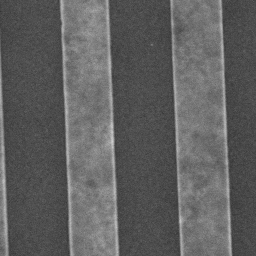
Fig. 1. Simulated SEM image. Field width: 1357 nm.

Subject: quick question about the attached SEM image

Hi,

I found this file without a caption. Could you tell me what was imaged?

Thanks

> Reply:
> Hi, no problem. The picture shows one or a few lines or trenches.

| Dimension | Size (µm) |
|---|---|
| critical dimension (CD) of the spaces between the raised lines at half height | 0.33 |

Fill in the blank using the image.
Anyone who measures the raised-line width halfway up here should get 264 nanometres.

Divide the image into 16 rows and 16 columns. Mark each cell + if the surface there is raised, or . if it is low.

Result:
....+++....+++..
....+++....+++..
....+++....+++..
....+++....+++..
....+++....+++..
....+++....+++..
....+++....+++..
....+++....+++..
....+++....+++..
....+++....+++..
....+++....+++..
....+++....+++..
....+++....+++..
....+++....+++..
....+++....+++..
....+++....+++..